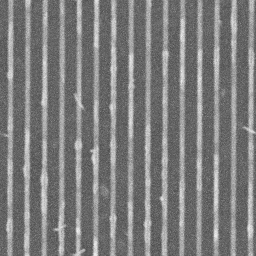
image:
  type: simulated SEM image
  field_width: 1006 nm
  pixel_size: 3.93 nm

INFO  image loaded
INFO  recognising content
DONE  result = parallel lines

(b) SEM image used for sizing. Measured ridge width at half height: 13.7 nm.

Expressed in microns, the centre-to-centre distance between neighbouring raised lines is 0.0675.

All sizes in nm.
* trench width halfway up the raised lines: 51.5